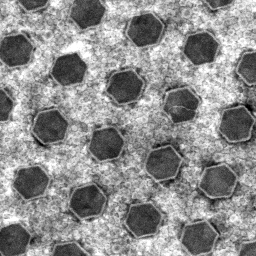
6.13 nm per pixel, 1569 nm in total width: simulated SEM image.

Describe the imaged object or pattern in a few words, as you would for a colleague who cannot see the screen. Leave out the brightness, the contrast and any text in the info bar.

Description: a regular array of raised bodies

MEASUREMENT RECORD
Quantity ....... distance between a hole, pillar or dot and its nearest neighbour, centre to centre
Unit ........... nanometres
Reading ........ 356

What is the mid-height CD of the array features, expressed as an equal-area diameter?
0.216 um